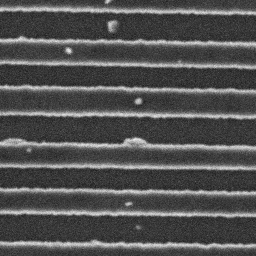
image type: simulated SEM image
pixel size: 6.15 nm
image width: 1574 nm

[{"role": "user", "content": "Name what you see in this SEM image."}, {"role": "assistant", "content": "lines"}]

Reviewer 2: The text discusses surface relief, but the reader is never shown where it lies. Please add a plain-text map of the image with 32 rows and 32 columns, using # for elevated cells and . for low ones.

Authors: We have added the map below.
################################
...................#############
................................
................................
................................
################################
################################
################################
..............................##
................................
................................
################################
################################
################################
...................###.#########
................................
................................
................##..............
################################
################################
################################
................................
................................
................................
################################
################################
################################
................................
................................
................................
##################...##.........
################################